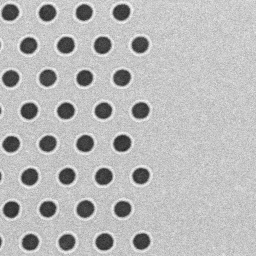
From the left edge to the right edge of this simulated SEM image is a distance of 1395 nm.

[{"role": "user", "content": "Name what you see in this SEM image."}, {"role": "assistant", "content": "a regular array of holes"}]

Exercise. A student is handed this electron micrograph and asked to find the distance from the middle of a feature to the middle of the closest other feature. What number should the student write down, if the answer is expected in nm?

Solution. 201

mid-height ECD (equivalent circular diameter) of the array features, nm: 104